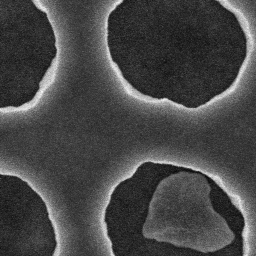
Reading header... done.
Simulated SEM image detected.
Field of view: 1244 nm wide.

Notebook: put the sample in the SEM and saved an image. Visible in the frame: holes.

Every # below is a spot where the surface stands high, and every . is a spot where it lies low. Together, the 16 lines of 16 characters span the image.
..#####.......##
...####........#
...####.........
....###........#
...#####.......#
...#####......##
..#########..###
################
################
################
#########...####
..#####.......##
...####........#
...####........#
...####........#
....###........#